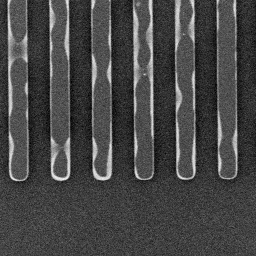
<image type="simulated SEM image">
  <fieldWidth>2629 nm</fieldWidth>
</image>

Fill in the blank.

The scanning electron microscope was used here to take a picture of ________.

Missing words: groups of lines, slits or small figures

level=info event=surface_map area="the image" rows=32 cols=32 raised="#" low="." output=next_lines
.##...##....##...##...##...##...
.##...##...###...##...##...##...
.##...##...###...##...##...##...
.##...##...###...##...##...##...
.##...##...###...##...##...##...
.##...##...###...##...##...##...
.##...##...###...##...##...##...
.##...###...##...##...##...##...
.##...###...##...##...##...##...
.##...###...##...##...##...##...
.##...###...##...##...##...##...
.##...###...##...##...##...###..
.##...###...##...##...##...###..
.##...###...##...##...##...##...
.##...###...##...##...##...##...
.##...###...##...##...##...###..
.##...###...##...##...##...##...
.##...###...##...##...##...##...
.##....#....##...##...##...##...
.##....##...##...##...##...###..
.##....##...##...##...##...###..
.##....##...##...##...##...###..
..#.............................
................................
................................
................................
................................
................................
................................
................................
................................
................................